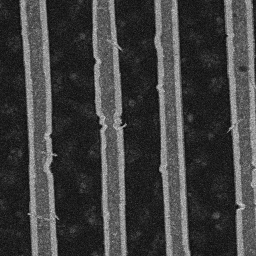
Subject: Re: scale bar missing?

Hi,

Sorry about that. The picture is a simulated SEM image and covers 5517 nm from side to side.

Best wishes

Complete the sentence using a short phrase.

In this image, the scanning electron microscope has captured one or a few lines or trenches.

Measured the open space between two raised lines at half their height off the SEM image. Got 1120 nm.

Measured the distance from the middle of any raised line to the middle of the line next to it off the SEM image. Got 1450 nm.